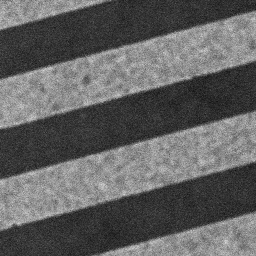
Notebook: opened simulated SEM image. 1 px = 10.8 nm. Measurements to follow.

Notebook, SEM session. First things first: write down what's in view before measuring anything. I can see one or a few lines or trenches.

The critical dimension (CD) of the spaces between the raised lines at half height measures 550 nm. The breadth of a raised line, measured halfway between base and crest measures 499 nanometres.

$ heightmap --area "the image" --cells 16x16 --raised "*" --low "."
*****...........
*............***
..........******
......**********
..***********...
*********.......
******..........
**............**
..........******
.......*********
...***********..
**********......
*******.........
***............*
............****
........********